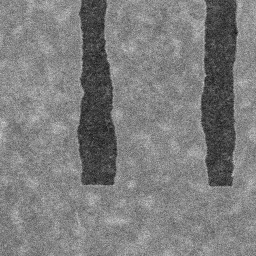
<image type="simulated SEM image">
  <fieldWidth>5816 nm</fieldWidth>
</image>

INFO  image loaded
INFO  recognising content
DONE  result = one or a few lines or trenches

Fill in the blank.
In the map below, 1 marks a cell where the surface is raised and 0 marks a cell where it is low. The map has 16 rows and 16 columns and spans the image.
1111100111111001
1111100111111001
1111100111111001
1111100111111001
1111100111111001
1111100111111001
1111100111111001
1111100111111001
1111100111111001
1111100111111001
1111100111111001
1111100111111011
1111111111111111
1111111111111111
1111111111111111
1111111111111111